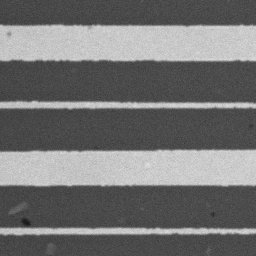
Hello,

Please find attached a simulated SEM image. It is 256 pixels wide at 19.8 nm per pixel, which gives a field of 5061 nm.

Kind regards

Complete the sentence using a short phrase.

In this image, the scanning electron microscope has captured lines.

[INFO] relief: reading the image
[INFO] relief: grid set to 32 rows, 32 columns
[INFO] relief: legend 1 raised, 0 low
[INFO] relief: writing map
00000000000000000000000000000000
00000000000000000000000000000000
00000000000000000000000000000000
11111111111111111111111111111111
11111111111111111111111111111111
11111111111111111111111111111111
11111111111111111111111111111111
11011101110010110001011111111001
00000000000000000000000000000000
00000000000000000000000000000000
00000000000000000000000000000000
00000000000000000000000000000000
00000000000000000000000000000000
00001000100000000000000000000000
00000000000000000000000000000000
00000000000000000000000000000000
00000000000000000000000000000000
00000000000000000000000000000000
00000000000000000000000000000000
11111111111111111111111111111111
11111111111111111111111111111111
11111111111111111111111111111111
11111111111111111111111111111111
00000000000000000000000000000000
00000000000000000000000000000000
00000000000000000000000000000000
00000000000000000000000000000000
00000000000000000000000000000000
00000000000000000000000000000000
00000000000000000000000000000000
00000000000000000000000000000000
00000000000000000000000000000000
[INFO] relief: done